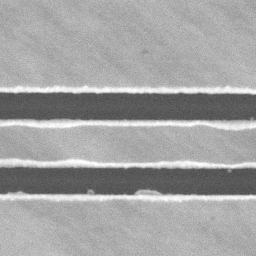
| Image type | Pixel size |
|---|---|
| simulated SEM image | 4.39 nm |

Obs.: lines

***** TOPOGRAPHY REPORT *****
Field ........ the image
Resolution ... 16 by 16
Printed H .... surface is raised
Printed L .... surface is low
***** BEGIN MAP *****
HHHHHHHHHHHHHHHH
HHHHHHHHHHHHHHHH
HHHHHHHHHHHHHHHH
HHHHHHHHHHHHHHHH
HHHHHHHHHHHHHHHH
HHHHHHHHHHHHHHHH
LLLLLLLLLLLLLLLL
LLLLLLLLLLLLLLLL
HHHHHHHHHHHHHHHH
HHHHHHHHHHHHHHHH
LLLLLLLLLLLLLLHL
LLLLLLLLLLLLLLLL
HHHHHHHHHHHHHHHH
HHHHHHHHHHHHHHHH
HHHHHHHHHHHHHHHH
HHHHHHHHHHHHHHHH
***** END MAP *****